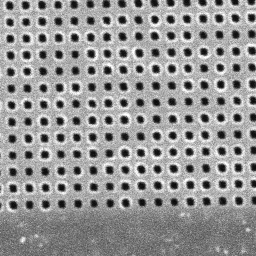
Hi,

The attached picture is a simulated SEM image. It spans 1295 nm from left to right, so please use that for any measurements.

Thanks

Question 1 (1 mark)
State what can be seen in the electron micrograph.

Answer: a regular array of holes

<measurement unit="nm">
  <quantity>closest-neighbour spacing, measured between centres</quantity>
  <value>80.9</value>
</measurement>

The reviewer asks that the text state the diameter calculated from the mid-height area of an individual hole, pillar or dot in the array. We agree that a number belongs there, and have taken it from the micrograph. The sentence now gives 0.0457 micrometres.